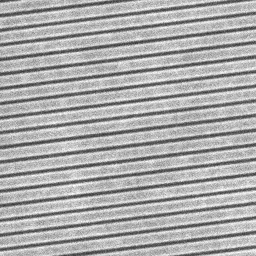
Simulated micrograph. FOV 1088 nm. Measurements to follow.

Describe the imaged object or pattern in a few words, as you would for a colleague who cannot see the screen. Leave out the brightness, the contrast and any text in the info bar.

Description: parallel lines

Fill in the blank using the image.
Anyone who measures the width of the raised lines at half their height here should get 40.6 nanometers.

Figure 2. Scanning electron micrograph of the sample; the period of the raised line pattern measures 0.0617 micrometres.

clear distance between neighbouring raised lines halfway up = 20 nanometers